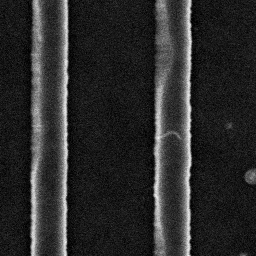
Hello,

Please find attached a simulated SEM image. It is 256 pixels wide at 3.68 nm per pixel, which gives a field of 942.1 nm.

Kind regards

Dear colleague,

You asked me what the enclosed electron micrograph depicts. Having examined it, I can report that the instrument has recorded lines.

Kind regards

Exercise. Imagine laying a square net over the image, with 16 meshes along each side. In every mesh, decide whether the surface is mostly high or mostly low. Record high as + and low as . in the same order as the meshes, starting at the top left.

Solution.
..++......++....
..++......++....
..++......++....
..++......++....
..++......++....
..++......++....
..++......++....
..++......++....
..++......++....
..++......++....
..++......++....
..++......++....
..++......++....
..++......++....
..++......++....
..++......++....